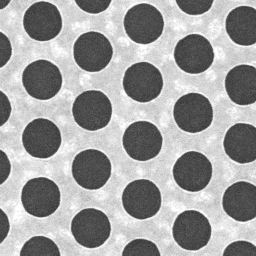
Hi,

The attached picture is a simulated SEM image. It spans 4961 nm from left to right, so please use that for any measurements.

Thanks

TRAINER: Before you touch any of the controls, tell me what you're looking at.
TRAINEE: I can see a regular array of holes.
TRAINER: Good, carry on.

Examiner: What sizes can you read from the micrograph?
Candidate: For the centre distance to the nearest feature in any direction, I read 1.12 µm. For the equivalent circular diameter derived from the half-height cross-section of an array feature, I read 789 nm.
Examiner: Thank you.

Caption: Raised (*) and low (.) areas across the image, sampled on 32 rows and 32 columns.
.***...***....***..***.....*****
***....****..***....***...***...
***.....*******.....********....
***.....********....********....
.***...***...***....***..****...
.********.....***..***....****..
..*******.....********.....*****
.****.***.....********.....*****
***....***...***....**....***...
***.....*******.....********....
***.....*******.....********....
***....***...***....********....
.****.***.....***..***....***...
.********.....********.....*****
.********.....********.....*****
.**....***...***...***....***..*
***.....********....***..***....
***.....*******.....********....
***....********.....********....
.***...**....***....***...**....
.********.....********....******
.********.....********.....*****
.***..***.....***..***....******
***....***...***....***...**....
***.....*******.....********....
***....********.....********....
.**....***...***....***..***....
.********.....********....***..*
.********.....********....******
.***..***.....********....******
***....***...***...***....***...
***....********.....********....